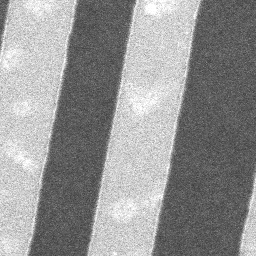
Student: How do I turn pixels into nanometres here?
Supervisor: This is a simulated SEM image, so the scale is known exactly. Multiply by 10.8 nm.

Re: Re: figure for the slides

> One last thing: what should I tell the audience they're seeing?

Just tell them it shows one or a few lines or trenches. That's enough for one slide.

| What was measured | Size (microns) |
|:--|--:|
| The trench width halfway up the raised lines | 0.649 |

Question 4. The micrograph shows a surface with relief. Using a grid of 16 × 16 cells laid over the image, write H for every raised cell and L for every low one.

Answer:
HLLLLHHHHLLLHHHH
LLLLHHHHLLLLHHHH
LLLLHHHHLLLLHHHH
LLLLHHHHLLLLHHHH
LLLLHHHHLLLLHHHH
LLLLHHHHLLLHHHHH
LLLHHHHLLLLHHHHH
LLLHHHHLLLLHHHHH
LLLHHHHLLLLHHHHH
LLLHHHHLLLLHHHHH
LLLHHHHLLLHHHHHH
LLHHHHLLLLHHHHHH
LLHHHHLLLLHHHHHH
LLHHHHLLLLHHHHHH
LLHHHHLLLLHHHHHL
LLHHHHLLLHHHHHHL